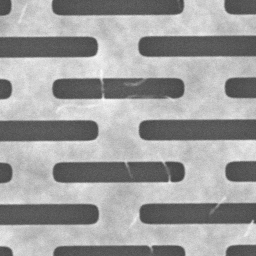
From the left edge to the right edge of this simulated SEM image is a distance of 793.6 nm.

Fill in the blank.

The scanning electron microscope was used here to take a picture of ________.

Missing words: groups of lines, slits or small figures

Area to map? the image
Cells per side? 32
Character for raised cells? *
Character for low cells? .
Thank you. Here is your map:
.*****.................*****....
.******................*****....
********************************
********************************
*******************.............
............*****...............
............*****...............
********************************
********************************
********************************
.******................*****....
.******................*****....
********.***********************
********************************
********************************
............******..............
............*****...............
...........********.............
********************************
********************************
.******................*****....
..*****................*****....
.******................******...
********************************
********************************
...........*******..............
............*****...............
............******..............
********************************
********************************
********************************
..*****................*****....